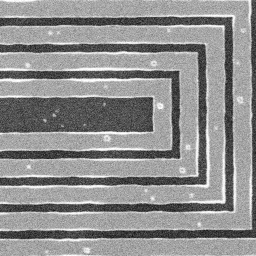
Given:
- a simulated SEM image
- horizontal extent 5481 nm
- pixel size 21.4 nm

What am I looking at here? groups of lines, slits or small figures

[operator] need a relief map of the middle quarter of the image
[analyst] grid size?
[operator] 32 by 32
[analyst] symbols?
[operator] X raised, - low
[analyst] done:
XXXXXXXXXXXXXXXXXXXXXXXXXXXXXXXX
X-------------------XX--XXXXXXXX
-----------------------------XXX
-----------------------------XXX
XXXXXXXXXXXXXXXXXXXXXXXXXXX--XXX
XXXXXXXXXXXXXXXXXXXXXXXXXXX--XXX
XXXXXXXXXXXXXXXXXXXXXXXXXXX--XXX
XXXXXXXXXXXXXXXXXXXXXXXXXXX--XXX
-----------------------XXXX--XXX
-----------------------XXXX--XXX
-----------------------XXXX--XXX
-----------------------XXXX--XXX
-----------------------XXXX--XXX
----------------------XXXXX--XXX
----------------------XXXXX--XXX
-----------------------XXXX--XXX
-----------------------XXXX--XXX
XXXXXXXXXXXXXXXXXXXXXXXXXXX--XXX
XXXXXXXXXXXXXXXXXXXXXXXXXXX--XXX
XXXXXXXXXXXXXXXXXXXXXXXXXXX--XXX
XXXXXXXXXXXXXXXXXXXXXXXXXXX--XXX
--XXX------------------------XXX
-----------------------------XXX
-----------------------------XXX
XXXXXXXXXXXXXXXXXXXXXXXXXXXXXXXX
XXXXXXXXXXXXXXXXXXXXXXXXXXXXXXXX
XXXXXXXXXXXXXXXXXXXXXXXXXXXXX-XX
XXXXXXXXXXXXXXXXXXXXXXXXXXXXXXXX
--------------------------------
--------------------------------
--------------XXXXX-------------
XXXXXXXXXXXXXXXXXXXXXXXXXXXXXXXX